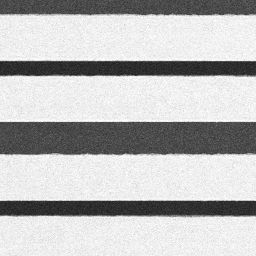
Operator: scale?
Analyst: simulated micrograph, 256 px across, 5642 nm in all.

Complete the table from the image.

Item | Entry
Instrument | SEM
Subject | lines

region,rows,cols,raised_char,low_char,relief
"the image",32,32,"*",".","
................................
................................
********************************
********************************
********************************
********************************
********************************
********************************
................................
................................
********************************
********************************
********************************
********************************
********************************
................................
................................
................................
................................
********************************
********************************
********************************
********************************
********************************
********************************
................................
................................
********************************
********************************
********************************
********************************
********************************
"